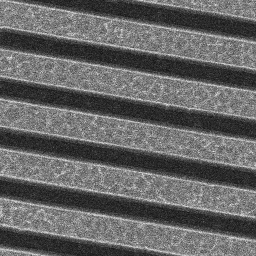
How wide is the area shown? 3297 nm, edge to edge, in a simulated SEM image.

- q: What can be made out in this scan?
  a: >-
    parallel lines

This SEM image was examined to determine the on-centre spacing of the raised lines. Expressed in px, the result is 48.9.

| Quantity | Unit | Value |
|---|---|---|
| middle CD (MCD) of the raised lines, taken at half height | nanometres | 386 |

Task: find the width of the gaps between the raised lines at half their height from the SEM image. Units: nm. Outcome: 244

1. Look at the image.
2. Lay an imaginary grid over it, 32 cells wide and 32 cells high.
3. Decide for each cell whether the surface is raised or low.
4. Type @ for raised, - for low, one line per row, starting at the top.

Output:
@@@@@-------------@@@@@@@@@@@@@@
@@@@@@@@@@---------------@@@@@@@
@@@@@@@@@@@@@@@@@--------------@
@@@@@@@@@@@@@@@@@@@@@@@---------
------@@@@@@@@@@@@@@@@@@@@@@@---
-----------@@@@@@@@@@@@@@@@@@@@@
@@@--------------@@@@@@@@@@@@@@@
@@@@@@@@@--------------@@@@@@@@@
@@@@@@@@@@@@@@@--------------@@@
@@@@@@@@@@@@@@@@@@@@@-----------
-----@@@@@@@@@@@@@@@@@@@@@@-----
----------@@@@@@@@@@@@@@@@@@@@@@
@@--------------@@@@@@@@@@@@@@@@
@@@@@@@@---------------@@@@@@@@@
@@@@@@@@@@@@@@---------------@@@
@@@@@@@@@@@@@@@@@@@-------------
---@@@@@@@@@@@@@@@@@@@@@@-------
---------@@@@@@@@@@@@@@@@@@@@@@@
@--------------@@@@@@@@@@@@@@@@@
@@@@@@@--------------@@@@@@@@@@@
@@@@@@@@@@@@@--------------@@@@@
@@@@@@@@@@@@@@@@@@@-------------
--@@@@@@@@@@@@@@@@@@@@@@@-------
--------@@@@@@@@@@@@@@@@@@@@@@@-
--------------@@@@@@@@@@@@@@@@@@
@@@@@@--------------@@@@@@@@@@@@
@@@@@@@@@@@@--------------@@@@@@
@@@@@@@@@@@@@@@@@@--------------
-@@@@@@@@@@@@@@@@@@@@@@@--------
-------@@@@@@@@@@@@@@@@@@@@@@@--
-------------@@@@@@@@@@@@@@@@@@@
@@@@---------------@@@@@@@@@@@@@